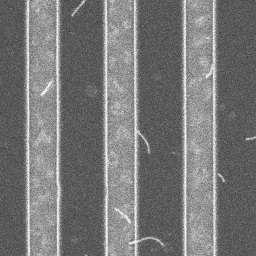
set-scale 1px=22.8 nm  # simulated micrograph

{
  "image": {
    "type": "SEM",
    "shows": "one or a few lines or trenches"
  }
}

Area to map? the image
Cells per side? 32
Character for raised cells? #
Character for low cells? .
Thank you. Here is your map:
####...######....######....#####
####...######....######....#####
####...######....######....#####
###....######....######....#####
###....######....######....#####
###....######....######....#####
###....######....######....#####
###....######....######....#####
###....######....######....#####
###....######....######....#####
###....######....######....#####
###....######....######....#####
###....######....######....#####
####...######....######....#####
####...######....######....#####
####...######....######....#####
####...######....######....#####
###....######....######....#####
###....######....######....#####
###....######....######....#####
###....######....######....#####
###....######....######....#####
####...######....######....#####
####...######....######....#####
###....######....######....#####
####...######....######....#####
####...######....######....#####
####...######....######....#####
####...######....######....#####
####...######....######....#####
####...######....######....#####
####...######....######....#####